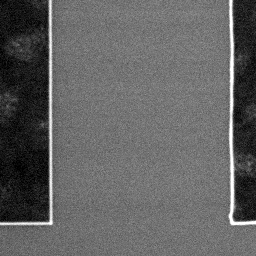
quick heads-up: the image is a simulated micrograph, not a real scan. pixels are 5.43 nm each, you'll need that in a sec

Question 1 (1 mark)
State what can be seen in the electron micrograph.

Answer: one or a few lines or trenches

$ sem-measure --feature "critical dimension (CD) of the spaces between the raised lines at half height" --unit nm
975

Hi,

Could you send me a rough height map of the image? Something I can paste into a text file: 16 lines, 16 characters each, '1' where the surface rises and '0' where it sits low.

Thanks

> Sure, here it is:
1110000000000011
1110000000000011
1110000000000011
1110000000000011
1110000000000011
1110000000000011
1110000000000011
1110000000000011
1110000000000011
1110000000000011
1110000000000011
1110000000000011
1110000000000001
1110000000000011
0000000000000000
0000000000000000